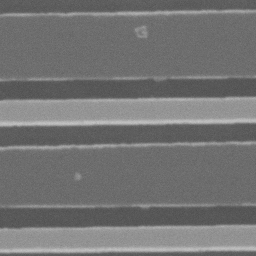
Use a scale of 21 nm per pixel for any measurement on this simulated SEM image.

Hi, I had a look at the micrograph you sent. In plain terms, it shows lines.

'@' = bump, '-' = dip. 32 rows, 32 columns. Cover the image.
--------------------------------
--------------------@@@@@@@@@@@@
@@@@@@@@@@@@@@@@@@@@@@@@@@@@@@@@
@@@@@@@@@@@@@@@@@@@@@@@@@@@@@@@@
@@@@@@@@@@@@@@@@@@@@@@@@@@@@@@@@
@@@@@@@@@@@@@@@@@@@@@@@@@@@@@@@@
@@@@@@@@@@@@@@@@@@@@@@@@@@@@@@@@
@@@@@@@@@@@@@@@@@@@@@@@@@@@@@@@@
@@@@@@@@@@@@@@@@@@@@@@@@@@@@@@@@
@@@@@@@@@@@@@@@@@@@@@@@@@@@@@@@@
--------------------------------
--------------------------------
---------@--@@@@@@@@@@@@@@@@@@@@
@@@@@@@@@@@@@@@@@@@@@@@@@@@@@@@@
@@@@@@@@@@@@@@@@@@@@@@@@@@@@@@@@
@@@@@@@-------------------------
--------------------------------
--------------------------------
@@@@@@@@@@@@@@@@@@@@@@@@@@@@@@@@
@@@@@@@@@@@@@@@@@@@@@@@@@@@@@@@@
@@@@@@@@@@@@@@@@@@@@@@@@@@@@@@@@
@@@@@@@@@@@@@@@@@@@@@@@@@@@@@@@@
@@@@@@@@@@@@@@@@@@@@@@@@@@@@@@@@
@@@@@@@@@@@@@@@@@@@@@@@@@@@@@@@@
@@@@@@@@@@@@@@@@@@@@@@@@@@@@@@@@
@@@@@@@@@@@@@@@@@@@@@@@@@@@@@@@@
--------------------------------
--------------------------------
-----------@@@@@@@@@@@@@@@@@@@@@
@@@@@@@@@@@@@@@@@@@@@@@@@@@@@@@@
@@@@@@@@@@@@@@@@@@@@@@@@@@@@@@@@
--------------------------------